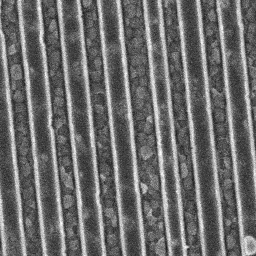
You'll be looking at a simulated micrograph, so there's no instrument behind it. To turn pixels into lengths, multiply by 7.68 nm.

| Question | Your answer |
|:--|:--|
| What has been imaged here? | parallel lines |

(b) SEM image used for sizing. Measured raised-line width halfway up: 158 nm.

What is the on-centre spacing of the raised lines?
305 nanometres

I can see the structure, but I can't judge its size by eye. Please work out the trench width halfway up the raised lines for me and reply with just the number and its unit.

18.8 pixels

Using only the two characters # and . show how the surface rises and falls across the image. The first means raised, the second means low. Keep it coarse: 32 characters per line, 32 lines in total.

..###..###..###...##..###..###..
...##..###..###...##..###..###..
...##...##...##...##..###..###..
...##...##...##...##...##...##..
...##...##...##...##...##...##..
#..##...##...##....#...##...##..
#..###..###..###...##..##...##..
#..###..###..###...##..###..###.
#..###..###..###...##..###..###.
#..###..###..###...##..###..###.
#..###..###..###...##..###..###.
#...##..###..###...##..###..###.
#...##..###...##...##..###..###.
#...##...##...##...##...##...##.
#...##...##...##....#...##...##.
##..##...##...##....#...##...##.
##..###..###..###...##..###..##.
##..###..###..###...##..###..###
##..###..###..###...##..###..###
##..###..###..###...##..###..###
##..###..###..###...##..###..###
##...##..###..###...##..###..###
##...##...##...##...##..###..###
##...##...##...##...##...##...##
##...##...##...##...##...##...##
###..##...##...##....##..##...##
###..###..###..###...##..###..##
###..###..###..###...##..###..##
###..###..###..###...##..###..##
###..###..###..###...##..###..##
###..###..###..###...##..###..##
.##...##..###..###...##..###..##